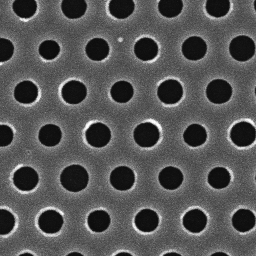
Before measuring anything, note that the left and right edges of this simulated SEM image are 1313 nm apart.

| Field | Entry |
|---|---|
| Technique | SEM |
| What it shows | a regular array of holes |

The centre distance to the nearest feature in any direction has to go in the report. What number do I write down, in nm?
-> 247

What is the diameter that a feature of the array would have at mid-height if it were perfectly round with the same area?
0.123 micrometres